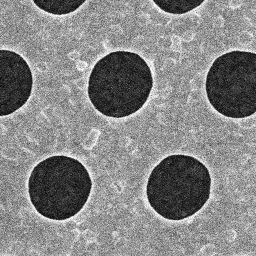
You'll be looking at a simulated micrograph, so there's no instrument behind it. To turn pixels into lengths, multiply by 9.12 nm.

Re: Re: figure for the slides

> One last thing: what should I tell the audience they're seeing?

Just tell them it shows holes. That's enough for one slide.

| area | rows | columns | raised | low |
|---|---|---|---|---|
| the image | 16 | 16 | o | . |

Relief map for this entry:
ooo..ooooo..oooo
oooooooooooooooo
oooooooooooooooo
.oooooo..ooooo..
..oooo...oooo...
..ooo....oooo...
.ooooo...oooo...
oooooooooooooooo
oooooooooooooooo
oooooooooooooooo
oo...ooooo...ooo
oo....ooo....ooo
oo...oooo....ooo
ooo..ooooo..oooo
oooooooooooooooo
oooooooooooooooo